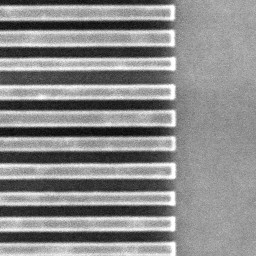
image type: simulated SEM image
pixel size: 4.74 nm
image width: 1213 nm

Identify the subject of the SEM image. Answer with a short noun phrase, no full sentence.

parallel lines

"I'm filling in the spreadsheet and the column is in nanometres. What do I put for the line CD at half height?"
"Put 62.2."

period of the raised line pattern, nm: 125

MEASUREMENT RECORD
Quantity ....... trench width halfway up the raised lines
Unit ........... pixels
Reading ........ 13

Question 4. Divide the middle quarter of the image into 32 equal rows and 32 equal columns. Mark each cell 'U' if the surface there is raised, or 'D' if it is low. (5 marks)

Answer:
UUUUUUUUUUUUUUUUUUUUUUUUUUUDDDDD
DDDDDDDDDDDDDDDDDDDDDDDDDDDDDDDD
DDDDDDDDDDDDDDDDDDDDDDDDDDDDDDDD
DDDDDDDDDDDDDDDDDDDDDDDDDDDDDDDD
DDDDDDDDDDDDDDDDDDDDDDDDDDDDDDDD
DDDDDDDDDDDDDDDDDUUUUDDDDDDDDDDD
UUUUUUUUUUUUUUUUUUUUUUUUUUUDDDDD
UUUUUUUUUUUUUUUUUUUUUUUUUUUDDDDD
UUUUUUUUUUUUUUUUUUUUUUUUUUUDDDDD
DDDDDDDDDDDDDDDDDDDDDDDDDDDDDDDD
DDDDDDDDDDDDDDDDDDDDDDDDDDDDDDDD
DDDDDDDDDDDDDDDDDDDDDDDDDDDDDDDD
UUUUUUUUUUUUUUUUUUUUUUUUUUUDDDDD
UUUUUUUUUUUUUUUUUUUUUUUUUUUDDDDD
UUUUUUUUUUUUUUUUUUUUUUUUUUUDDDDD
DDDDDDDDDDDDDDDDDDDDDDDDDDDDDDDD
DDDDDDDDDDDDDDDDDDDDDDDDDDDDDDDD
DDDDDDDDDDDDDDDDDDDDDDDDDDDDDDDD
UUUUUUUUUUUUUUUUUUUUUUUUUUUDDDDD
UUUUUUUUUUUUUUUUUUUUUUUUUUUUDDDD
UUUUUUUUUUUUUUUUUUUUUUUUUUUUDDDD
DDDDDDDDDDDDDDDDDDDDDDDDDDDDDDDD
DDDDDDDDDDDDDDDDDDDDDDDDDDDDDDDD
DDDDDDDDDDDDDDDDDDDDDDDDDDDDDDDD
DDDDDDDDDDDDDDDDDDDDDDDDDDDDDDDD
UUUUUUUUUUUUUUUUUUUUUUUUUUUDDDDD
UUUUUUUUUUUUUUUUUUUUUUUUUUUDDDDD
UUUUUUUUUUUUUUUUUUUUUUUUUUUDDDDD
DDDDDDDDDDDDDDDDDDDDDDDDDDDDDDDD
DDDDDDDDDDDDDDDDDDDDDDDDDDDDDDDD
DDDDDDDDDDDDDDDDDDDDDDDDDDDDDDDD
DDDDDDDDDDDDDDDDDDDDDDDDDDDDDDDD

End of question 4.